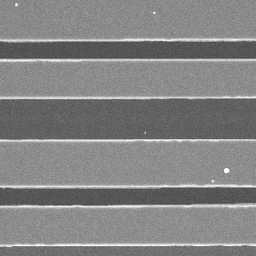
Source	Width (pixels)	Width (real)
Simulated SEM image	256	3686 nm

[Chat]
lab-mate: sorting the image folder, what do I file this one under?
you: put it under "lines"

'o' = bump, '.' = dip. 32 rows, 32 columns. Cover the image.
oooooooooooooooooooooooooooooooo
oooooooooooooooooooooooooooooooo
oooooooooooooooooooooooooooooooo
oooooooooooooooooooooooooooooooo
oooooooooooooooooooooooooooooooo
................................
................................
o...ooo...ooo.oooooooooooooooooo
oooooooooooooooooooooooooooooooo
oooooooooooooooooooooooooooooooo
oooooooooooooooooooooooooooooooo
oooooooooooooooooooooooooooooooo
................................
................................
................................
................................
................................
................................
oooooooooooooooooooooooooooooooo
oooooooooooooooooooooooooooooooo
oooooooooooooooooooooooooooooooo
oooooooooooooooooooooooooooooooo
oooooooooooooooooooooooooooooooo
................................
................................
................................
oooooooooooooooooooooooooooooooo
oooooooooooooooooooooooooooooooo
oooooooooooooooooooooooooooooooo
oooooooooooooooooooooooooooooooo
oooooooooooooooooooooooooooooooo
................................